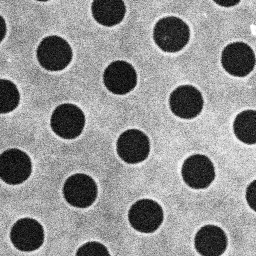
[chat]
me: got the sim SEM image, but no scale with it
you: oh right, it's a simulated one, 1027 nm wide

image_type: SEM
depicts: a regular array of holes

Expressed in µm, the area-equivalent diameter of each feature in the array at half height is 0.142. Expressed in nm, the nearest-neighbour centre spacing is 276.